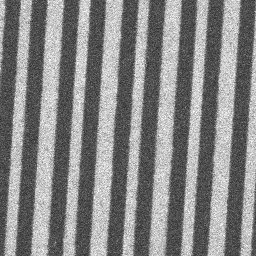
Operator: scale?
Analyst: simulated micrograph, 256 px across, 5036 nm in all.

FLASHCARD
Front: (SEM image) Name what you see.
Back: parallel lines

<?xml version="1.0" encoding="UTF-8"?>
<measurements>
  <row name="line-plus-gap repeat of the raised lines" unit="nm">582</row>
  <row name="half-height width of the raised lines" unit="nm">348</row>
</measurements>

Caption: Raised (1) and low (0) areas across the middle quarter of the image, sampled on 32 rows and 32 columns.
11100111110001111100111100001111
11100111110001111100111100001111
11100111110001111100111100001111
11100111100001111100111100001111
11100111100001111100111100001111
11100111100001111000111100001111
11100111100001111000111100001111
11100111100001111000111100001111
11000111100001111000111100001111
11000111100001111000111100001111
11000111100001111001111100011111
11000111100001111001111100011111
11000111100001111001111100011111
11000111100001111001111100011111
11000111100001111001111100011111
11001111100011111001111000011111
11001111100011111001111000011110
11001111100011111001111000011110
11001111100011111001111000011110
11001111000011111001111000011110
11001111000011111001111000011110
11001111000011110001111000011110
11001111000011110001111000011110
11001111000011110001111000011110
10001111000011110001111000011110
10001111000011110011111000011110
10001111000011110011111000011110
10001111000011110011111000111110
10001111000011110011111000111110
10001111000011110011110000111110
10011111000011110011110000111110
10011111000111110011110000111100